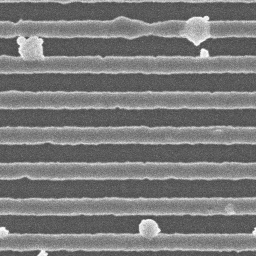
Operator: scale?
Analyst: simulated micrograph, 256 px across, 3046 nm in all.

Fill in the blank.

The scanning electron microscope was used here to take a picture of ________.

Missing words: parallel lines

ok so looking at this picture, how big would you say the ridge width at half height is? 192 nm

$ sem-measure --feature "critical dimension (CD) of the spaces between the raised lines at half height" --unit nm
234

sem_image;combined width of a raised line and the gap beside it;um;0.421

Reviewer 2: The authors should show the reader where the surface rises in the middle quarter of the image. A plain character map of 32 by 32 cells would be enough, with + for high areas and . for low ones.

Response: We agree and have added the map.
++++++++++++++++++++++++++++++++
++++++++++++++++++++++++++++++++
................................
................................
................................
................................
................................
++++++++++++++++++++++++++++++++
++++++++++++++++++++++++++++++++
++++++++++++++++++++++++++++++++
++++++++++++++++++++++++++++++++
................................
................................
................................
................................
................................
++++++++++++++++++++++++++++++++
++++++++++++++++++++++++++++++++
++++++++++++++++++++++++++++++++
++++++++++++++++++++++++++++++++
................................
................................
................................
................................
................................
++++++++++++++++++++++++++++++++
++++++++++++++++++++++++++++++++
++++++++++++++++++++++++++++++++
+++++++++++++++++.++.+++++..++++
................................
................................
................................